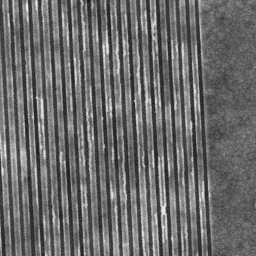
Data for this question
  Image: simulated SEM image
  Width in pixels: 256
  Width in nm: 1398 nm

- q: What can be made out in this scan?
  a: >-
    parallel lines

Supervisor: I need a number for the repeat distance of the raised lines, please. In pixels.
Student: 9.8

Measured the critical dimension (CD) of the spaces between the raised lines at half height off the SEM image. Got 21.1 nm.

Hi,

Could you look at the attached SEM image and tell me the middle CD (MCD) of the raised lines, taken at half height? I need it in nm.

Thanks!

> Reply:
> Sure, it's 31.4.